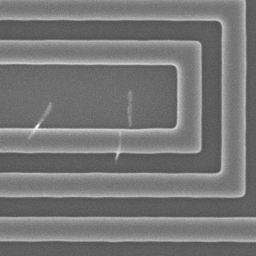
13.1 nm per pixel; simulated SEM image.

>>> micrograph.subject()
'groups of lines, slits or small figures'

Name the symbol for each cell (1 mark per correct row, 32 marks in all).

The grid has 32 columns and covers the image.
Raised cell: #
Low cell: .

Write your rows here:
###############################.
###############################.
...........................####.
............................###.
............................###.
#########################...###.
#########################...###.
#########################...###.
......................###...###.
......................###...###.
......................###...###.
......................###...###.
......................###...###.
......................###...###.
......................###...###.
......................###...###.
#########################...###.
#########################...###.
#########################...###.
............................###.
............................###.
...........................####.
###############################.
###############################.
.##...##...##.###..##..#######..
................................
................................
################################
################################
################################
................................
................................